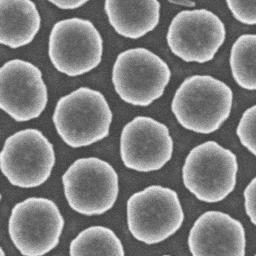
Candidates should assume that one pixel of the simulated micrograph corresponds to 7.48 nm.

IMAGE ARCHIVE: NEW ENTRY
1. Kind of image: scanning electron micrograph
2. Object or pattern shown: a regular array of raised bodies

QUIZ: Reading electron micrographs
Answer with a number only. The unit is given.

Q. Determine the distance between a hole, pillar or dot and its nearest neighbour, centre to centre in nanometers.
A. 513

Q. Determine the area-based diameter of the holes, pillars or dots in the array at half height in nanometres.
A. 418